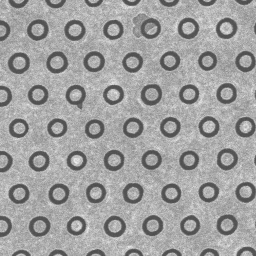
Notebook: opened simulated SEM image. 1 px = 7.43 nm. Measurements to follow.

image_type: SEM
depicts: a regular array of ring-shaped grooves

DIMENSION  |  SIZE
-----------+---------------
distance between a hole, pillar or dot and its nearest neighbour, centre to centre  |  275 nm